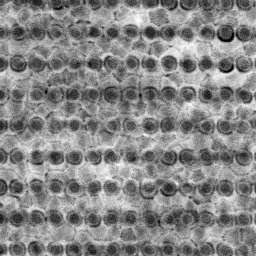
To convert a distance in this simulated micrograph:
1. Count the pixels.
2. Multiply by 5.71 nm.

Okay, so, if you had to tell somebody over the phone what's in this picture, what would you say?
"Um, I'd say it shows a regular array of raised bodies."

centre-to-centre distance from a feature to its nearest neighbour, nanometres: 107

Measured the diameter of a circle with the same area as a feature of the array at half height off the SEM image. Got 73.2 nm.